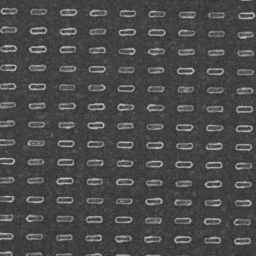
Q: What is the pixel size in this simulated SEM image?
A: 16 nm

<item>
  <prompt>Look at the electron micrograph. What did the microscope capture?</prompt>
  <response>a regular array of holes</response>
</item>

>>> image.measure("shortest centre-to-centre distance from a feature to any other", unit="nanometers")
297